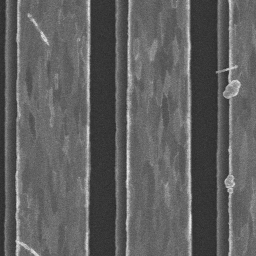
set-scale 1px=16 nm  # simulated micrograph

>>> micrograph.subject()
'lines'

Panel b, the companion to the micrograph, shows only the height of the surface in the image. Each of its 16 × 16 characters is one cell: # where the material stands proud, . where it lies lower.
.#####..####..##
.#####..####..##
.#####..####..##
.#####..####..##
.#####..####..##
.#####..####..##
.#####..####..##
.#####..####..##
.#####..####..##
.#####..####..##
.#####..####..##
.#####..####..##
.#####..####..##
.#####..####..##
.#####..####..##
.####...####..##